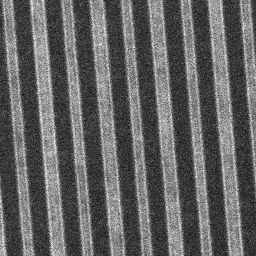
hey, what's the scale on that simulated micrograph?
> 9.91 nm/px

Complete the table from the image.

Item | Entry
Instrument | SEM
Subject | parallel lines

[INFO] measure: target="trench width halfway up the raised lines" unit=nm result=77.8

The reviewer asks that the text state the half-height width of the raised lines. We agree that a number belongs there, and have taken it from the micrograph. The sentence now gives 202 nm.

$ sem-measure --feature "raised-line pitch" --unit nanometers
294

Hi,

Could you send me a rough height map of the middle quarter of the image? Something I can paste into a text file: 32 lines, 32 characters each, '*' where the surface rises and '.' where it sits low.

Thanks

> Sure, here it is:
*..*****...*****..*****...*****.
*..*****...*****..*****...*****.
*..*****...*****..*****...*****.
*..*****...*****..*****...*****.
*...****...*****..*****...*****.
*...*****..*****..*****...*****.
**..*****..*****..*****...*****.
**..*****...*****.*****...*****.
**..*****...*****.*****...*****.
**..*****...*****..*****..******
**..*****...*****..*****..******
**..*****...*****..*****...*****
**..*****...*****..*****...*****
**..*****...*****..*****...*****
**..*****...*****..*****...*****
**..*****...*****..*****...*****
**..*****...*****..*****...*****
**..******..*****..*****...*****
***.******..*****..*****...*****
***..*****...*****.*****...*****
***..*****...*****..****...*****
***..*****...*****..*****..*****
***..*****...*****..*****..*****
***..*****...*****..*****...****
***..*****...*****..*****...****
***..*****...*****..*****...****
***..*****...*****..*****...****
***..*****...*****..*****...****
***..*****...*****..*****...****
***..******..*****..*****...****
****.******...****..*****...****
****..*****...*****.*****...****